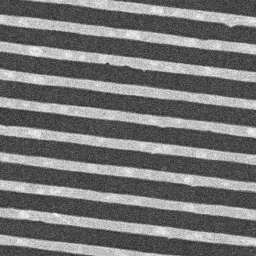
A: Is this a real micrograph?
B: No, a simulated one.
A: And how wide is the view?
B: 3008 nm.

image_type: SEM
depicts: parallel lines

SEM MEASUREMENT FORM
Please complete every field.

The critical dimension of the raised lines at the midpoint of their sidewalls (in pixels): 10.1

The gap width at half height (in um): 0.204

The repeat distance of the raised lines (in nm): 322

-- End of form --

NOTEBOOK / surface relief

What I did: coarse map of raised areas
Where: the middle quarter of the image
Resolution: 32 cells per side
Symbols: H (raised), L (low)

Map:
LLLLLLLLLLLLLLLLHHHHHHHHHHHHHHHH
LLLLLLLLLLLLLLLLLLLLLLHHHHHHHHHH
LLLLLLLLLLLLLLLLLLLLLLLLLLLLLLHH
HLLLLLLLLLLLLLLLLLLLLLLLLLLLLLLL
HHHHHHHHHHHLLLLLLLLLLLLLLLLLLLLL
HHHHHHHHHHHHHHHHHHHLLLLLLLLLLLLL
LLLLLLLLHHHHHHHHHHHHHHHHHHLLLLLL
LLLLLLLLLLLLLLHHHHHHHHHHHHHHHHHH
LLLLLLLLLLLLLLLLLLLLLLLHHHHHHHHH
LLLLLLLLLLLLLLLLLLLLLLLLLLLLLLLL
HHHLLLLLLLLLLLLLLLLLLLLLLLLLLLLL
HHHHHHHHHHHHLLLLLLLLLLLLLLLLLLLL
HHHHHHHHHHHHHHHHHHLLLLLLLLLLLLLL
LLLLLLLLHHHHHHHHHHHHHHHHHHLLLLLL
LLLLLLLLLLLLLLLLLHHHHHHHHHHHHHHH
LLLLLLLLLLLLLLLLLLLLLLLHHHHHHHHH
LLLLLLLLLLLLLLLLLLLLLLLLLLLLLLLL
HHLLLLLLLLLLLLLLLLLLLLLLLLLLLLLL
HHHHHHHHHHLLLLLLLLLLLLLLLLLLLLLL
LHHHHHHHHHHHHHHHHHHHLLLLLLLLLLLL
LLLLLLLLHHHHHHHHHHHHHHHHHHHHHLLL
LLLLLLLLLLLLLLLLLHHHHHHHHHHHHHHH
LLLLLLLLLLLLLLLLLLLLLLLLHLHHHHHH
LLLLLLLLLLLLLLLLLLLLLLLLLLLLLLLL
HHLLLLLLLLLLLLLLLLLLLLLLLLLLLLLL
HHHHHHHHHHHHHLLLLLLLLLLLLLLLLLLL
HHHHHHHHHHHHHHHHHHHHHLLLLLLLLLLL
LLLLLLLLLLHHHHHHHHHHHHHHHHHHHLLL
LLLLLLLLLLLLLLLLLLHHHHHHHHHHHHHH
LLLLLLLLLLLLLLLLLLLLLLLLLLLHHHHH
LLLLLLLLLLLLLLLLLLLLLLLLLLLLLLLL
HHHHHLLLLLLLLLLLLLLLLLLLLLLLLLLL